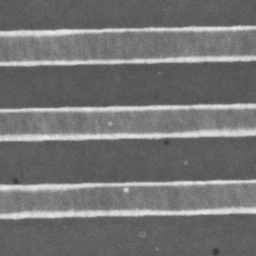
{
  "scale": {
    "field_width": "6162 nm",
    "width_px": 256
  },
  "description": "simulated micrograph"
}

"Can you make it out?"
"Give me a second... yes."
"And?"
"lines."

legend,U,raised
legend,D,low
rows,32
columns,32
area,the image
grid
DDDDDDDDDDDDDDDDDDDDDDDDDDDDDDDD
DDDDDDDDDDDDDDDDDDDDDDDDDDDDDDDD
DDDDDDDDDDDDDDDDDDDDDDDDDDDDDDDD
DDDDDDDDDDDDDDDDDDDDDDDDDUUUUUUU
UUUUUUUUUUUUUUUUUUUUUUUUUUUUUUUU
UUUUUUUUUUUUUUUUUUUUUUUUUUUUUUUU
UUUUUUUUUUUUUUUUUUUUUUUUUUUUUUUU
UUUUUUUUUUUUUUUUUUUUUUUUUUUUUUUU
DDDDDDDDDDDDDDDDDDDDDDDDDDDDDDDD
DDDDDDDDDDDDDDDDDDDDDDDDDDDDDDDD
DDDDDDDDDDDDDDDDDDDDDDDDDDDDDDDD
DDDDDDDDDDDDDDDDDDDDDDDDDDDDDDDD
DDDDDDDDDDDDDDDDDDDDDDDDDDDDDDDD
DDDDDDDDDUUUUUUUUUUUUUUUUUUUUUUU
UUUUUUUUUUUUUUUUUUUUUUUUUUUUUUUU
UUUUUUUUUUUUUUUUUUUUUUUUUUUUUUUU
UUUUUUUUUUUUUUUUUUUUUUUUUUUUUUUU
UDDDDDDDDDDDDDDDDDDDDDDDDDDDDDDD
DDDDDDDDDDDDDDDDDDDDDDDDDDDDDDDD
DDDDDDDDDDDDDDDDDDDDDDDDDDDDDDDD
DDDDDDDDDDDDDDDDDDDDDDDDDDDDDDDD
DDDDDDDDDDDDDDDDDDDDDDDDDDDDDDDD
DDDDDDDDDDDDDDDDDDDDDDDDDDDDDDDD
UUUUUUUUUUUUUUUUUUUUUUUUUUUUUUUU
UUUUUUUUUUUUUUUUUUUUUUUUUUUUUUUU
UUUUUUUUUUUUUUUUUUUUUUUUUUUUUUUU
UUUUUUUUUUUUUUUUUUUUUUUUUUUUUUUU
DDDDDDDDDDDDDDDDDDDDDDDDDDDDDDDD
DDDDDDDDDDDDDDDDDDDDDDDDDDDDDDDD
DDDDDDDDDDDDDDDDDDDDDDDDDDDDDDDD
DDDDDDDDDDDDDDDDDDDDDDDDDDDDDDDD
DDDDDDDDDDDDDDDDDDDDDDDDDDDDDDDD